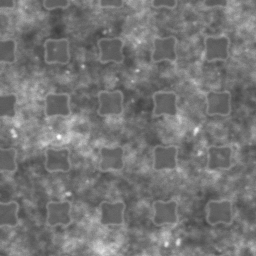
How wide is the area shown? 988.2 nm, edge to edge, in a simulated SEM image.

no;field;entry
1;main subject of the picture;a regular array of raised bodies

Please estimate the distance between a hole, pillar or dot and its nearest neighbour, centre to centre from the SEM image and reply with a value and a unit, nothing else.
205 nanometres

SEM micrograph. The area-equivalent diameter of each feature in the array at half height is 101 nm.